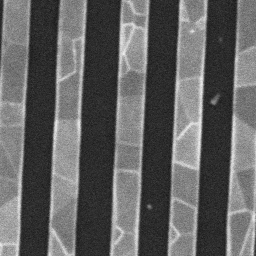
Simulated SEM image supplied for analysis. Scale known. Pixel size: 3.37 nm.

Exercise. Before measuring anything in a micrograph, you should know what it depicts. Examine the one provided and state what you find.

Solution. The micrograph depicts groups of lines, slits or small figures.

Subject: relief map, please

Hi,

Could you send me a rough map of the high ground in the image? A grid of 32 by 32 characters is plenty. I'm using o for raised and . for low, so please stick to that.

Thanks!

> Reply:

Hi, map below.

.ooo....ooo....oooo....ooo....oo
.ooo....ooo....ooo.....ooo....oo
oooo...oooo....ooo.....ooo....oo
oooo...oooo....ooo....oooo....oo
oooo...ooo.....ooo....oooo....oo
oooo...ooo.....ooo....oooo....oo
ooo....ooo.....ooo....oooo....oo
ooo....ooo.....ooo....ooo....ooo
ooo....ooo.....ooo....ooo....ooo
ooo....ooo.....ooo....ooo....ooo
ooo....ooo.....ooo....ooo....ooo
ooo....ooo.....ooo....ooo....ooo
ooo....ooo.....ooo....ooo....ooo
ooo....ooo.....ooo....ooo....ooo
ooo....ooo.....ooo....ooo....ooo
ooo....ooo.....ooo....ooo....ooo
ooo....ooo.....ooo....ooo....ooo
ooo....ooo.....ooo....ooo....ooo
ooo....ooo....oooo....ooo....ooo
ooo....ooo....oooo....ooo....ooo
ooo....ooo....oooo....ooo....ooo
ooo....ooo....ooo.....ooo....ooo
oo....oooo....ooo....oooo....ooo
oo....oooo....ooo....oooo....ooo
oo....oooo....ooo....oooo....ooo
oo....oooo....ooo....oooo....ooo
oo....oooo....ooo....oooo....ooo
oo....ooo.....ooo....oooo....ooo
oo....ooo.....ooo....oooo....ooo
oo....ooo.....ooo....oooo....ooo
oo....ooo.....ooo....ooo.....ooo
oo....ooo.....ooo....ooo.....ooo